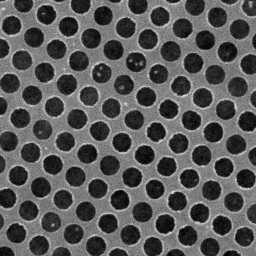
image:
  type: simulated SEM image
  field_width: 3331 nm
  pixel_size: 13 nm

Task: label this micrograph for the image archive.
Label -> a regular array of holes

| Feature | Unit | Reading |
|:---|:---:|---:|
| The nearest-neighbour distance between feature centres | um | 0.328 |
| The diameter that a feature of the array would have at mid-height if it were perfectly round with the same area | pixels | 20.2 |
